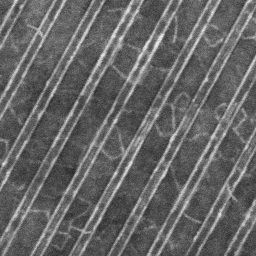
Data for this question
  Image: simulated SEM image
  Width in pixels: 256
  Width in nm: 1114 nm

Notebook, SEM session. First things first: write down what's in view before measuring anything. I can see parallel lines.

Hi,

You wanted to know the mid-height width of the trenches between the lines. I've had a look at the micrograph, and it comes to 23.7 px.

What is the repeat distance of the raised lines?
148 nm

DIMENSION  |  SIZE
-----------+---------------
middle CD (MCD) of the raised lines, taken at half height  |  10.1 px